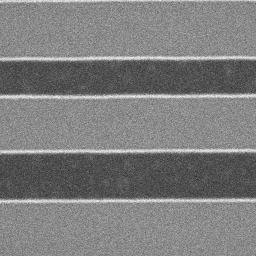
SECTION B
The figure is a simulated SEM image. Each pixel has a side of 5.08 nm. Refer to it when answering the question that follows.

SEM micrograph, one or a few lines or trenches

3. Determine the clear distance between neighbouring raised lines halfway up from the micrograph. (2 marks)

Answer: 274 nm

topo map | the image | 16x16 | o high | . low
................
................
................
................
oooooooooooooooo
oooooooooooooooo
................
................
................
oooooooooooooooo
oooooooooooooooo
oooooooooooooooo
oooooooooooooooo
................
................
................